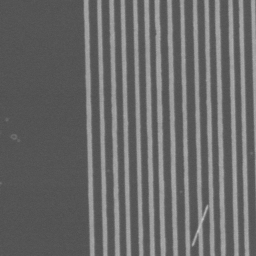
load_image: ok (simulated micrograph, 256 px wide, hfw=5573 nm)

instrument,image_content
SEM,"parallel lines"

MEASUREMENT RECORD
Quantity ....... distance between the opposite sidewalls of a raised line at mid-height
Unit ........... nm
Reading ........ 81.6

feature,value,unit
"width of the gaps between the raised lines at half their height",8.25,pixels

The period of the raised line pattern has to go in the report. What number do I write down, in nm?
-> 259